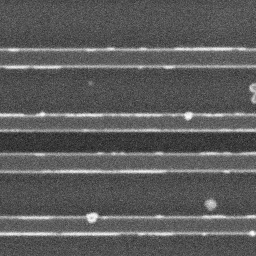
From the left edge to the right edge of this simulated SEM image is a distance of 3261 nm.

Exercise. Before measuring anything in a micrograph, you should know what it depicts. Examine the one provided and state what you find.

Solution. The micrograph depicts lines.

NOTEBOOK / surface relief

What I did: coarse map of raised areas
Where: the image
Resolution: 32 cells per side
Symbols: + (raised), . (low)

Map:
................................
................................
................................
................................
................................
................................
++++++++++++++++++++++++++++++++
++++++++++++++++++++++++++++++++
................................
................................
................................
................................
................................
................................
++++++++++++++++++++++++++++++++
++++++++++++++++++++++++++++++++
................................
................................
................................
++++++++++++++++++++++++++++++++
++++++++++++++++++++++++++++++++
................................
................................
................................
................................
................................
................................
++++++++++++++++++++++++++++++++
++++++++++++++++++++++++++++++++
................................
................................
................................